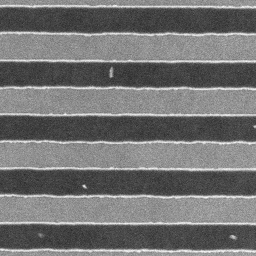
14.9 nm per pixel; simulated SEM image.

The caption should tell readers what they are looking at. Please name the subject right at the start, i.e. lines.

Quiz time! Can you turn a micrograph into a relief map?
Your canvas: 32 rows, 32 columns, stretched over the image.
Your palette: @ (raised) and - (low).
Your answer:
--------------------------------
@@@@@@@@@@@@@@@@@@@@@@@@@@@@@@@@
@@@@@@@@@@@@@@@@@@@@@@@@@@@@@@@@
@@@@@@@@@@@@@@@@@@@@@@@@@@@@@@@@
--------------------------------
--------------------------------
--------------------------------
--------------------------------
@@@@@@@@@@@@@@@@@@@@@@@@@@@@@@@@
@@@@@@@@@@@@@@@@@@@@@@@@@@@@@@@@
@@@@@@@@@@@@@@@@@@@@@@@@@@@@@@@@
--------------------------------
--------------------------------
--------------------------------
@@@@@@@@@@@@@@@@@@@@@@@@@@@@@@@@
@@@@@@@@@@@@@@@@@@@@@@@@@@@@@@@@
@@@@@@@@@@@@@@@@@@@@@@@@@@@@@@@@
@@@@@@@@@@@@@@@@@@@@@@@@@@@@@@@@
--------------------------------
--------------------------------
--------------------------------
@@@@@@@@@@@@@@@@@@@@@@@@@@@@@@@@
@@@@@@@@@@@@@@@@@@@@@@@@@@@@@@@@
@@@@@@@@@@@@@@@@@@@@@@@@@@@@@@@@
---@--@@@@@@@@@@@@@@@@@@@@@@@@@@
--------------------------------
--------------------------------
--------------------------------
@@@@@@@@@@@@@@@@@@@@@@@@@@@@@@@@
@@@@@@@@@@@@@@@@@@@@@@@@@@@@@@@@
@@@@@@@@@@@@@@@@@@@@@@@@@@@@@@@@
--------------------------------